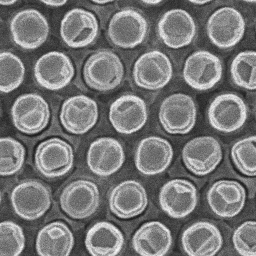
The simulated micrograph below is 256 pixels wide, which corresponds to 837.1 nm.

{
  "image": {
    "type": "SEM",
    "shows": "a regular array of raised bodies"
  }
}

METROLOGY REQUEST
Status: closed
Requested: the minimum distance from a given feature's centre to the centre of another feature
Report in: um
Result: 0.158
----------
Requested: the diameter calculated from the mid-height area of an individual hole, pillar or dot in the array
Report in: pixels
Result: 37.7